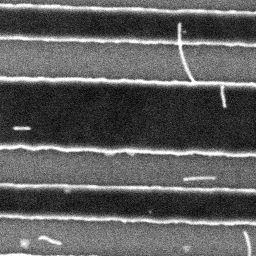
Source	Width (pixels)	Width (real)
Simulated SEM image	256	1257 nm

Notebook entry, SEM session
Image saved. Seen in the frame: lines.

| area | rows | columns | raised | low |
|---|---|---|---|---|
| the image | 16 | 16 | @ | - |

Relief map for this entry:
@@@@@@@---------
@@@@@@@@@@@@@@@@
--@@@@@@@@@@@@@@
----------------
----------------
@@@@@@@@@@@@@@@@
@@@@@@@@@@@@@@@@
@@@@@@@@@@@@@@@@
@@@@@@@@@@@@@@@@
------@@@@@@@@@@
----------------
----------------
@@@@@@@@@@@@@@@@
@@@@@@@@@@@@@@@@
----------------
----------------